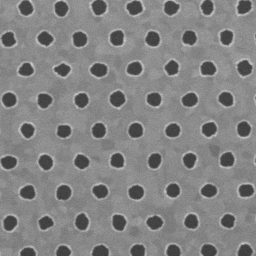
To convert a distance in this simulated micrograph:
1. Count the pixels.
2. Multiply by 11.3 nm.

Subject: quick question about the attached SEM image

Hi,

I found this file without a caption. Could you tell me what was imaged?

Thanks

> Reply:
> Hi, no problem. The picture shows a regular array of holes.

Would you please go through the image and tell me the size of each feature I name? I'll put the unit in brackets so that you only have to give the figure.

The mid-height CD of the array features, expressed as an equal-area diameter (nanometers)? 178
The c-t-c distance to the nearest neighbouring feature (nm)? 395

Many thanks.